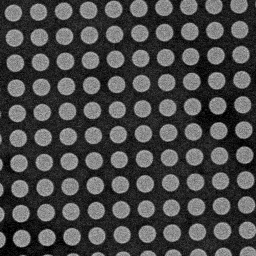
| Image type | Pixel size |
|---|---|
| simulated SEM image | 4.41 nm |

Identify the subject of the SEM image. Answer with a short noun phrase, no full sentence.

an array of small figures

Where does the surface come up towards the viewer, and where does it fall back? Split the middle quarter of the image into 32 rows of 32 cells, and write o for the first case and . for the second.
oo...ooo....oo....oo............
................................
...............................o
......oo....oo....ooo...ooo...oo
oo...oooo..oooo..oooo...oooo..oo
ooo..oooo..oooo..oooo...oooo..oo
oo...oooo...ooo...ooo....oo.....
o...............................
................................
..................ooo...ooo...oo
oo...oooo..oooo...oooo..oooo..oo
ooo..oooo..oooo...oooo..oooo..oo
ooo..oooo...ooo...ooo...ooo....o
oo....oo........................
................................
...................oo....oo....o
oo....ooo...ooo...oooo..oooo..oo
ooo..oooo...oooo..oooo..oooo..oo
ooo..oooo...ooo...oooo..oooo...o
ooo...ooo....o..................
................................
................................
oo....ooo...ooo...oooo...ooo...o
ooo...oooo..oooo..oooo..oooo...o
ooo..ooooo..oooo..oooo...ooo...o
ooo...ooo....oo....oo...........
................................
................................
.......oo....oo....ooo...ooo...o
ooo...oooo..oooo..oooo...oooo..o
oooo..oooo..oooo..oooo...oooo..o
ooo...oooo...ooo...ooo....oo....